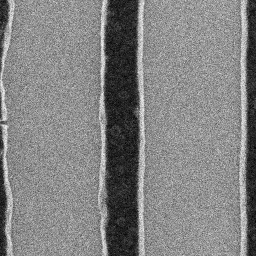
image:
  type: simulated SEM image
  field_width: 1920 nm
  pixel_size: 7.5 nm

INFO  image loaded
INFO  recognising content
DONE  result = one or a few lines or trenches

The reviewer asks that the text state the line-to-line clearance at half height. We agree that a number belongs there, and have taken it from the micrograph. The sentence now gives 746 nanometers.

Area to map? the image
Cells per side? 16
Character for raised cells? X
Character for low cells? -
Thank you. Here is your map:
X-----XXX------X
X-----XXX------X
------XXX------X
------XXX------X
------XXX------X
------XXX------X
------XXX------X
------XXX------X
------XXX------X
------XXX------X
------XXX------X
------XXX------X
X-----XXX------X
X-----XXX------X
X-----XXX------X
X------XX------X